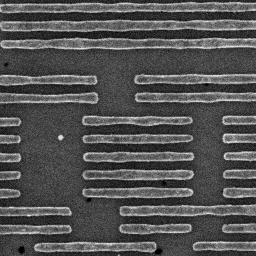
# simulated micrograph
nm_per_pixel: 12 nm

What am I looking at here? wiring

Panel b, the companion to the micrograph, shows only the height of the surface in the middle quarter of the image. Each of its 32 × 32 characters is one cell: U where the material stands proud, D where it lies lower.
DDDDDDDDDDDDDDDDDDDDDDDDDDDDDDDD
DDDDDDDDDDDDDDDDDDDDDDDDDDDDDDDD
DDDDDDDDDDDDDDDDDDDDDDDDDDDDDDDD
UUUUUUUUDDDDDDDDDDUUUUUUUUUUUUUU
UUUUUUUUDDDDDDDDDDUUUUUUUUUUUUUU
DDDDDDDDDDDDDDDDDDDDDDDDDDDDDDDD
DDDDDDDDDDDDDDDDDDDDDDDDDDDDDDDD
DDDDUUUUDDDDDDDDDDUUUUUUUUUUUUUU
UUUUUUUUDDDDDDDDDDUUUUUUUUUUUUUU
DDDDDDUUDDDDDDDDDDDDDDDDDDDDDDDD
DDDDDDDDDDDDDDDDDDDDDDDDDDDDDDDD
DDDDDDDDDDDDDDDDDDDDDDDDDDDDDDDD
DDDDDDDDDDDDDDDDDDDDDDDDDDDDDDDD
DDDDDUUUUUUUUUUUUUUUUUUUUUUUUUUU
DDDDDUUUUUUUUUUUUUUUUUUUUUUUUUUU
DDDDDDDDDDDDDDDDDDDDDDDDDDDDDDDD
DDDDDDDDDDDDDDDDDDDDDDDDDDDDDDDD
DDDDDDDDDDDDDDDDDDDDDDDDDDDDDDDD
DDDDDUUUUUUUUUUUUUUUUUUUUUUUUUUU
DDDDDUUUUDUUUUUUUUUUUUUUUUUUDDDD
DDDDDDDDDDDDDDDDDDDDDDDDDDDDDDDD
DDDDDDDDDDDDDDDDDDDDDDDDDDDDDDDD
DDDDDUUUUUUUUUUUUUUUUUUUUUUUUUUU
DDDDDUUUUUUUUUUUUUUUUUUUUUUUUUUU
DDDDDDDDDDDDDDDDDDDDDDDDDDDDDDDD
DDDDDDDDDDDDDDDDDDDDDDDDDDDDDDDD
DDDDDDDDDDDDDDDDDDDDDDDDDDDDDDDD
DDDDDUUUUUUUUUUUUUUUUUUUUUUUUUUU
DDDDDUUUUUUUUUUUUUUUUUUUUUUUUUUU
DDDDDDDDDDDDDDDDDDDDDDDDDDDDDDDD
DDDDDDDDDDDDDDDDDDDDDDDDDDDDDDDD
DDDDDUUUUUUUUUUUUUUUUUUUUUUUUUUU